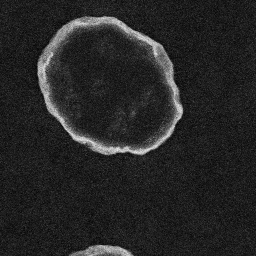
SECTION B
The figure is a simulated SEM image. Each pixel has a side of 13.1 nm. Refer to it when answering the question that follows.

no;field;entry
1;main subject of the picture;raised bodies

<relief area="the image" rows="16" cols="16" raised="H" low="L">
LLLLLLLLLLLLLLLL
LLLLLHHLLLLLLLLL
LLLLHHHHHLLLLLLL
LLLHHHHHHHLLLLLL
LLLHHHHHHHHLLLLL
LLLHHHHHHHHLLLLL
LLLHHHHHHHHLLLLL
LLLLHHHHHHHLLLLL
LLLLLHHHHHLLLLLL
LLLLLLLLHLLLLLLL
LLLLLLLLLLLLLLLL
LLLLLLLLLLLLLLLL
LLLLLLLLLLLLLLLL
LLLLLLLLLLLLLLLL
LLLLLLLLLLLLLLLL
LLLLLLLLLLLLLLLL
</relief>